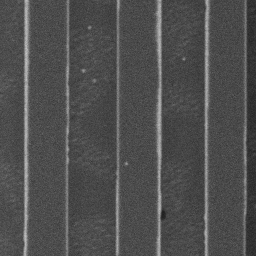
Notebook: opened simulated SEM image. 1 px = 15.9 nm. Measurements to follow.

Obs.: lines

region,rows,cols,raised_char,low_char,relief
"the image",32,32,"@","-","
---@@@@@@------@@@@@------@@@@@-
---@@@@@@------@@@@@------@@@@@-
---@@@@@@------@@@@@------@@@@@-
---@@@@@@------@@@@@------@@@@@-
---@@@@@@------@@@@@------@@@@@-
---@@@@@@------@@@@@------@@@@@-
---@@@@@@------@@@@@------@@@@@-
---@@@@@@------@@@@@------@@@@@-
---@@@@@@------@@@@@------@@@@@-
---@@@@@@------@@@@@------@@@@@-
---@@@@@@------@@@@@------@@@@@-
---@@@@@@------@@@@@------@@@@@-
---@@@@@@------@@@@@------@@@@@-
---@@@@@@------@@@@@------@@@@@-
---@@@@@@------@@@@@------@@@@@-
---@@@@@@------@@@@@------@@@@@-
---@@@@@@------@@@@@------@@@@@-
---@@@@@@------@@@@@------@@@@@-
---@@@@@@------@@@@@------@@@@@-
---@@@@@@------@@@@@------@@@@@-
---@@@@@@------@@@@@------@@@@@-
---@@@@@-------@@@@@------@@@@@-
---@@@@@-------@@@@@------@@@@@-
---@@@@@-------@@@@@------@@@@@-
---@@@@@-------@@@@@------@@@@@-
---@@@@@-------@@@@@------@@@@@-
---@@@@@-------@@@@@------@@@@@-
---@@@@@-------@@@@@------@@@@@-
---@@@@@-------@@@@@------@@@@@-
---@@@@@-------@@@@@------@@@@@-
---@@@@@-------@@@@@------@@@@@-
---@@@@@-------@@@@@------@@@@@-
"